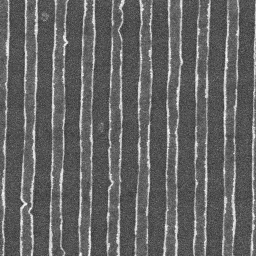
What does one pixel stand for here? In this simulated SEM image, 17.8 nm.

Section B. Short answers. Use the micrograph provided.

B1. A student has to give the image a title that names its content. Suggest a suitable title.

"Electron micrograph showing parallel lines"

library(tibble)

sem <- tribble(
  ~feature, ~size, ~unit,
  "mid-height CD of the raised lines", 196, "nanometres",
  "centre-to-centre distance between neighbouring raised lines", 511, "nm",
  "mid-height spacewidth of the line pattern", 17.6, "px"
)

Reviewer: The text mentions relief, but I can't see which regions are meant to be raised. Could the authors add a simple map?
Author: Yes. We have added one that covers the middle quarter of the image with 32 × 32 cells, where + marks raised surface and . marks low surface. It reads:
.....++.....++.....+++....+++...
.....++.....++.....+++....+++...
.....++.....++.....+++....+++...
.....++.....++.....+++....+++...
.....++.....++.....+++....+++...
.....++.....++.....+++....+++...
.....++.....++.....+++....+++...
....+++.....++.....+++....+++...
....+++....+++.....+++....+++...
....+++....+++.....+++....++....
....+++....+++.....+++....++....
....+++....+++.....++.....+++...
....+++.....++.....++.....+++...
....+++.....++.....++.....+++...
....+++.....++.....++.....+++...
....+++....+++.....++.....++....
....+++....+++.....++.....++....
....+++....+++.....++.....++....
....+++....+++.....++.....++....
....+++....+++.....++.....++....
....+++.....++.....++.....++....
....+++....+++.....++.....++....
....+++....+++.....++.....++....
....+++....+++.....++.....++....
....+++.....++.....++.....++....
....+++.....++.....++.....++....
....+++....+++.....++.....++....
....+++....+++.....++.....++....
....+++.....++.....++.....++....
....+++.....++.....++.....++....
....+++.....++....+++.....++....
....+++....+++....+++.....++....